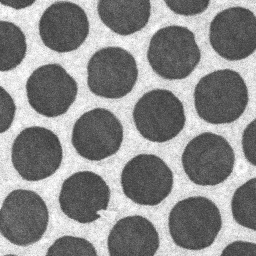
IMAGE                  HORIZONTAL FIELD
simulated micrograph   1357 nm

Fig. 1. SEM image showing a regular array of holes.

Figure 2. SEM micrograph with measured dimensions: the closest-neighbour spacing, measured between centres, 338 nm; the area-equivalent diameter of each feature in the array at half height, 279 nm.